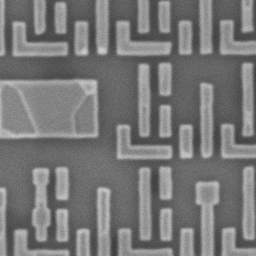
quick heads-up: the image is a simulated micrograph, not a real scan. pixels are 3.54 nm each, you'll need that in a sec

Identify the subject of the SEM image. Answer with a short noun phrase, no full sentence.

wiring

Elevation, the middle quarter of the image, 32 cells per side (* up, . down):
...................**...***.....
...................**...***.....
...................**...***.....
...................**...**......
********...........**...**......
********...........**...**......
********...........**...**......
********...........**...**......
********...........**...........
********...........**...........
********...........**...........
********...........**...**......
********...........**...**......
********...........**...**......
********...........**...**......
********...........**...**......
********.....***...**...**...***
********.....***...**...***..***
..............**.............***
..............**.............***
..............***............***
..............*************..***
..............*************..***
................................
................................
................................
*..................**...**......
*..................**...**......
*..................**...***.....
*..................**...***.....
*..................**...***.....
*........**........**...***.....